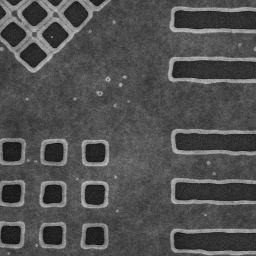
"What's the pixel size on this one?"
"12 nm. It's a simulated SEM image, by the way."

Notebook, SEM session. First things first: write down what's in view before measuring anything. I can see groups of lines, slits or small figures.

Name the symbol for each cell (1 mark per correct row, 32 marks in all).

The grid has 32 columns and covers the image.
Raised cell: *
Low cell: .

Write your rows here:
.....*..*.*..*******************
.**...**...***********..........
***...**...***********..........
...***..*.************..........
....*....***********************
*....*..************************
**....**************************
***...****************..........
****.****************...........
*********************...........
********************************
********************************
********************************
********************************
********************************
********************************
**********************......*...
**********************..........
...**...**...*********..........
...**...**...*******************
***********..*******************
********************************
**********************.*********
...**...**...*********..........
...**...**...*********..........
*.***...***..*******************
********************************
********************************
...**...***..*******************
...**...**...*********..........
...**...**...*********..........
*************************.......